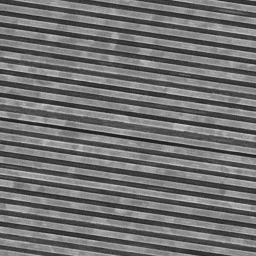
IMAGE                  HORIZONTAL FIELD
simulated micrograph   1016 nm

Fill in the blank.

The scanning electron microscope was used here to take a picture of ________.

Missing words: parallel lines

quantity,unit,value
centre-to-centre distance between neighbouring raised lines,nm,46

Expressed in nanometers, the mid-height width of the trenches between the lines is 22.1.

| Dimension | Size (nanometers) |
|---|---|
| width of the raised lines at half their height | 26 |